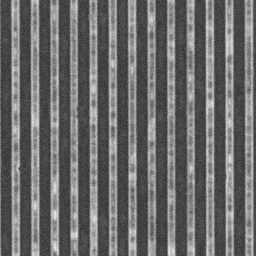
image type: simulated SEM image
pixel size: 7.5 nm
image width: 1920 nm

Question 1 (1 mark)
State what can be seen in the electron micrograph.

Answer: parallel lines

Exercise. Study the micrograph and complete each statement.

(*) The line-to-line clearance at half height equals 95.6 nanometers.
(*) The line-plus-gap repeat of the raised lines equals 0.146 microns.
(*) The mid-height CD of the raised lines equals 6.75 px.